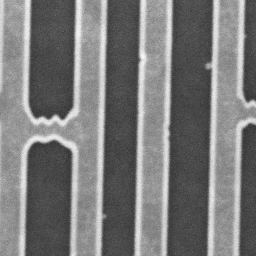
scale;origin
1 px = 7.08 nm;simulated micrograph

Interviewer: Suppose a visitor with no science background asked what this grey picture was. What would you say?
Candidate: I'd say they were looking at one or a few lines or trenches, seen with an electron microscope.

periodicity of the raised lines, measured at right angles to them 490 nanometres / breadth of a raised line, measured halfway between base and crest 186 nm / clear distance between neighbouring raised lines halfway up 0.32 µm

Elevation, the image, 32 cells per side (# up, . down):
####......###.....###......###..
###.......###.....###......###..
###.......###.....###......###..
###.......###.....###......###..
###.......###.....###......###..
###.......###.....###......###..
###.......###.....###......###..
###.......###.....###......###..
###.......###.....###......###..
###.......###.....###......###..
###.......###.....###......###..
###.......###.....###......###..
###.......###.....###......####.
###......####.....###......#####
####.....####.....###......#####
#############.....###......####.
#############.....###......###..
####.#.######....####......###..
###......####....####......###..
###......####....####......###..
###......####....####......###..
###......####....####......###..
###......####....####......###..
###......###.....####......###..
###......###.....####.....####..
###......###.....####.....####..
###......###.....####.....####..
###......###.....####.....####..
###......###.....####.....####..
###......###.....####.....####..
###......###.....####.....####..
###......###.....####.....####..